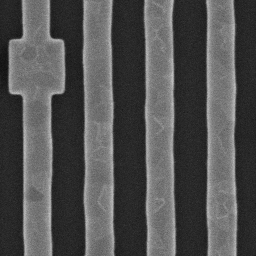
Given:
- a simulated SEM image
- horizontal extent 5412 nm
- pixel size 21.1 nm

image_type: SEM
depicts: wiring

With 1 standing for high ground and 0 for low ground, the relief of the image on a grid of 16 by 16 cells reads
0110011001100110
0110011001100110
0111011001100110
0111011001100110
0111011001100110
0111011001100110
0110011001100110
0110011001100110
0110011001100110
0110011001100110
0110011001100110
0110011001100110
0110011001100110
0110011001100110
0110011001100110
0010011001100110